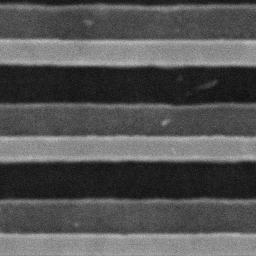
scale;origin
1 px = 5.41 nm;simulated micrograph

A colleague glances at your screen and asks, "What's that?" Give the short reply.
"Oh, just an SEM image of lines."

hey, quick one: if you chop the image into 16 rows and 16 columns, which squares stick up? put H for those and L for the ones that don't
HHHHHHHHHHHHHHHH
HHHHHHHHHHHHHHHH
HHHHHHHHHHHHHHHH
HHHHHHHHHHHHHHHH
LLLLLLLLLLLLLLLL
LLLLLLLLLLLLLLLL
LLLLLLLLLLLLLLLL
HHHHHHHHHHHHHHHH
HHHHHHHHHHHHHHHH
HHHHHHHHHHHHHHHH
LLLLLLLLLLLLLLLL
LLLLLLLLLLLLLLLL
LLLLLLLLLLLLLLLL
HHHHHHHHHHHHHHHH
HHHHHHHHHHHHHHHH
HHHHHHHHHHHHHHHH